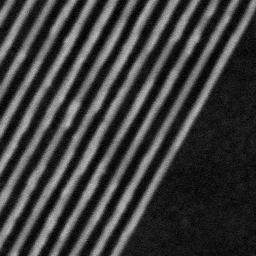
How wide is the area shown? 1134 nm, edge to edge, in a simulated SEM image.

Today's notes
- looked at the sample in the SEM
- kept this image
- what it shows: parallel lines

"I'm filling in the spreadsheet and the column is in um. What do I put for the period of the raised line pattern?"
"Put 0.0792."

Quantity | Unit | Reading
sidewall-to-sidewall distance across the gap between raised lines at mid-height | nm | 48.9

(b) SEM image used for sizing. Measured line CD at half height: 30 nm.